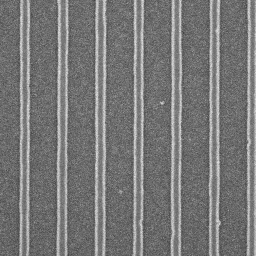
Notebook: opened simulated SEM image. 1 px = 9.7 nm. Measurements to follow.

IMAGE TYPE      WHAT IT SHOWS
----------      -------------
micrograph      parallel lines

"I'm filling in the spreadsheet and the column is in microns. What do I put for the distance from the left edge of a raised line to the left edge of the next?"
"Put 0.368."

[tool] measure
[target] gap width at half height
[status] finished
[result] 291 nm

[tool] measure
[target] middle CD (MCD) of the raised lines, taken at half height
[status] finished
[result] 7.49 pixels